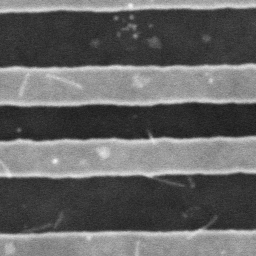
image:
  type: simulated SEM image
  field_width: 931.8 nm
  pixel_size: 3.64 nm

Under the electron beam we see lines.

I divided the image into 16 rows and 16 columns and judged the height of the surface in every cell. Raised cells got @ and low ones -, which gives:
@@@@@@@@@@@@@@--
----------------
----------------
----------------
@@@@@@@@@@@@@@@@
@@@@@@@@@@@@@@@@
@@@@@@-@@@------
----------------
----------------
@@@@@@@@@@@@@@@@
@@@@@@@@@@@@@@@@
----------------
----------------
----------------
------@@@@@@@@@@
@@@@@@@@@@@@@@@@